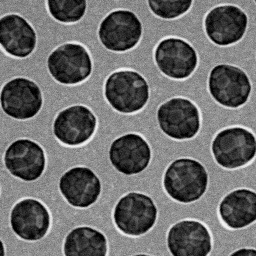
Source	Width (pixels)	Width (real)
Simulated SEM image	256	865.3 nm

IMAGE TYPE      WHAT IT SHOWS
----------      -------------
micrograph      a regular array of holes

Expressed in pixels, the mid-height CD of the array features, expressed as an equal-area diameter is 41.9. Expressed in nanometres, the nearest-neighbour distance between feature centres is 202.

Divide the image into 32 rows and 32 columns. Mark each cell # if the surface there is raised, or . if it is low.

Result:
######.....########.....########
######.....###..###....###....##
...####...###....#########.....#
....########......########.....#
....########......########....##
....####..###....###....###..###
#...###....########.....########
######.....########......#######
######.....#########....###...##
#######....###....###...##.....#
#...#########.....########.....#
.....########......#######.....#
.....########.....###...###....#
.....###...###....##.....#######
#...###.....########.....#######
#######.....########.....#######
#######.....########.....###...#
##.####....###....#########.....
#....#########.....#######......
#.....########.....########.....
#.....########.....##....##....#
#....###....###...###.....######
###.####....########......######
#######......########.....######
########....###...###....###....
##...####..####....#########....
#.....########......#######.....
#.....########.....#########....
##....####.####....##.....###.##
##....##.....###.####.....######
########.....########.....######
.#######.....########.....###...